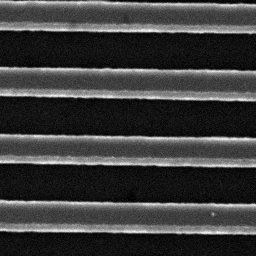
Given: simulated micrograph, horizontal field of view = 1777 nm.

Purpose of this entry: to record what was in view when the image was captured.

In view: lines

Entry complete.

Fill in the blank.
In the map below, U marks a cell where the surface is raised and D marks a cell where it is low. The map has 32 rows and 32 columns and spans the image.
UUUUUUUUUUUUUUUUUUUUUUUDDDDDDDDD
UUUUUUUUUUUUUUUUUUUUUUUUUUUUUUUU
UUUUUUUUUUUUUUUUUUUUUUUUUUUUUUUU
UUUUUUUUUUUUUUUUUUUUUUUUUUUUUUUU
DDDDDDDDDDDDDDDDDDDDDDDDDDDDDDDD
DDDDDDDDDDDDDDDDDDDDDDDDDDDDDDDD
DDDDDDDDDDDDDDDDDDDDDDDDDDDDDDDD
DDDDDDDDDDDDDDDDDDDDDDDDDDDDDDDD
DDDDDDDDDDDDDDDDDDDDDDDDDDDDDDDD
UUUUUUUUUUUUUUUUUUUUUUUUUUUUUUUU
UUUUUUUUUUUUUUUUUUUUUUUUUUUUUUUU
UUUUUUUUUUUUUUUUUUUUUUUUUUUUUUUU
DDDDDDDDDDDDDDDDDDDDDDDDDDDDUDUU
DDDDDDDDDDDDDDDDDDDDDDDDDDDDDDDD
DDDDDDDDDDDDDDDDDDDDDDDDDDDDDDDD
DDDDDDDDDDDDDDDDDDDDDDDDDDDDDDDD
DDDDDDDDDDDDDDDDDDDDDDDDDDDDDDDD
UUUUUUUUUUUUUUUUUUUUUUUUUUUUUUUU
UUUUUUUUUUUUUUUUUUUUUUUUUUUUUUUU
UUUUUUUUUUUUUUUUUUUUUUUUUUUUUUUU
DDDDDDDDDDDUDUUUUUUUUUUUUUUUUUUU
DDDDDDDDDDDDDDDDDDDDDDDDDDDDDDDD
DDDDDDDDDDDDDDDDDDDDDDDDDDDDDDDD
DDDDDDDDDDDDDDDDDDDDDDDDDDDDDDDD
DDDDDDDDDDDDDDDDDDDDDDDDDDDDDDDD
UUUUUUUUUUUUUUUUUUUUDUDDDDDDDDDD
UUUUUUUUUUUUUUUUUUUUUUUUUUUUUUUU
UUUUUUUUUUUUUUUUUUUUUUUUUUUUUUUU
UUUUUUUUUUUUUUUUUUUUUUUUUUUUUUUU
DDDDDDDDDDDDDDDDDDDDDDDDDDDDDDDD
DDDDDDDDDDDDDDDDDDDDDDDDDDDDDDDD
DDDDDDDDDDDDDDDDDDDDDDDDDDDDDDDD